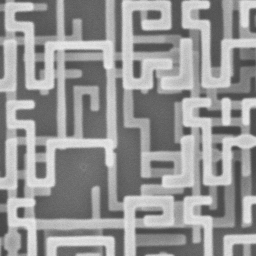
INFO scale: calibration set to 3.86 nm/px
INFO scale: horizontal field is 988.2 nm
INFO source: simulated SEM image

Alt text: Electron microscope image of wiring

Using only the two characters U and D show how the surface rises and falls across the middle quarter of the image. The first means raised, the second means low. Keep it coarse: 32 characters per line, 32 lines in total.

DDDDDDDDDDUUUDDUUDDDUUUUUUUDDUUU
DDDDDDDDDDDUUDDUUDDDUUDUUUUUUUUU
DDDDDDDDDDDUUDDUUDDDUUDUUUUUUUUU
DDDDDDDDDDDUUDDUUUDUUUDDUUUUUUUU
DDDDDDDDDDDUUDDUUUUUUUDDUUUUUUUU
DDDDDDDDDDDUUDDUUUUUUUDDUUUUUUUU
DDDDDDDDDDDUUDDDDDDDDDDDDDDDDDDU
DDDDDDDDDDDUUDDDDDDDDDDDDDDDDDDD
DDDDDDDDDDDUUDDDDDDDDDDDDDDDDDDU
DDDDDDDDDDDUUDDDDDDDDDDDDDDDDDUU
DDDDDDDDDDDUUDDDDDDDDDDDDDDDDDUU
DDDDDDDDDDDUUDDDDDDDDDDDDDDDDDUU
DDDDDDDDDDDUUDDDDDDDDDDDDDDDDDUU
DDDDDDDDDDDUUDDDDDDDDDDDDDDDDDUU
DDDDDDDDDDDUUDDDDDDDDDDDDDDDDDUU
DDDDDDDDDDDUUDDDDDDDDDDDDDDDDDDD
DDDDDDDDDDDUUDDDDDDDDDDDDDDDDDDD
DDDDDDDDDDDUUDDDDDDDDDDDDDDDDDDD
UDDDDDDDDDDUUDDDDDDDDDDDDDDDDDUU
UUUUUUUUUUUUUDDDDDDDDDDDDDDDDUUU
UUUUUUUUUUUUUDDDDDDDDDDDDDDDDUUU
DDDDDDDDDDUUDDDDDDDDDDDDDDDDDUUU
DDDDDDDDDDUUDDDDDDDUUUUUUUUUUUUU
DDDDDDDDDDUUDDDDDDDUUUUUUUUUUUUU
DDDDDDDDDDUUDDDDDDDUUDDDDDDDUUUU
DDDDDDDDDDDUDDDDDDDUUDDDDDDDUUUU
DDDDDDDDDDDDDDDDDDDUUDDDDDDDUUUU
DDDDDDDDDDDDDDDDDDDUUDDDDDDDUUUU
DDDDDDDDDDDDDDDDDDDDDDDDDUUUUUUU
DDDDDDDDDDDDDDDDDDDDDDDDDUUUUUUU
DDDDDDDDDDDDDDDDDDDUUUUUUUUUUUUU
DDDDDDDDDDDDDDDDDDDUUUUUUUUUUUDD